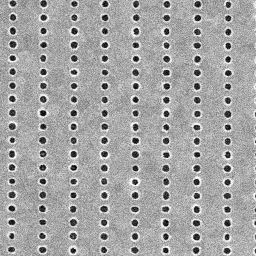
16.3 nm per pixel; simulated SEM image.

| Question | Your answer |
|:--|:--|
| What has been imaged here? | a regular array of holes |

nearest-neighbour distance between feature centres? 13.5 pixels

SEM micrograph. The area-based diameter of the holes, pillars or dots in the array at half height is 115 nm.